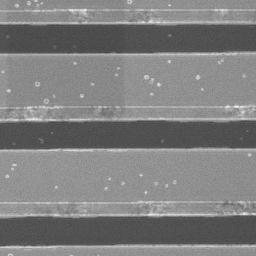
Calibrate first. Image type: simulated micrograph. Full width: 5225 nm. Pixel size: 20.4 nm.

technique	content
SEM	lines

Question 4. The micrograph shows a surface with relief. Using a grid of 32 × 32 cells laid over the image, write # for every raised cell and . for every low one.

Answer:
################################
################################
################################
................................
................................
................................
................................
################################
################################
################################
################################
################################
################################
################################
################################
................................
................................
................................
................................
################################
################################
################################
################################
################################
################################
################################
################################
................................
................................
................................
................................
################################